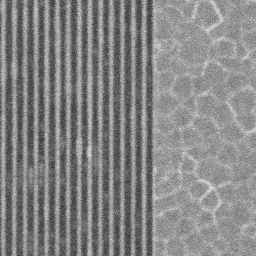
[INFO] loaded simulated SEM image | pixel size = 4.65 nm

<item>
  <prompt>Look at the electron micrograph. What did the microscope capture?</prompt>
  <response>parallel lines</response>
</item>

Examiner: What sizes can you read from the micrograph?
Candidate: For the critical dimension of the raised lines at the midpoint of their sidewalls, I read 14.5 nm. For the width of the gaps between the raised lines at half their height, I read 36.6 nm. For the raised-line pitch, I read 50.4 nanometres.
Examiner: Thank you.